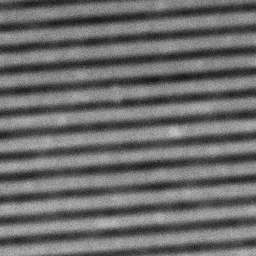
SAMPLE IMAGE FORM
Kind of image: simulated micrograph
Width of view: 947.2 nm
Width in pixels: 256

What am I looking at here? parallel lines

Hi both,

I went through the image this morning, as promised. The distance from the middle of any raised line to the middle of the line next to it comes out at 0.079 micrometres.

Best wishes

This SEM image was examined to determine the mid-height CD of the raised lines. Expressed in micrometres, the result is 0.035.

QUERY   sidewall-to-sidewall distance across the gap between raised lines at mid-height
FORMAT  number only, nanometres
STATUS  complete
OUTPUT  44.2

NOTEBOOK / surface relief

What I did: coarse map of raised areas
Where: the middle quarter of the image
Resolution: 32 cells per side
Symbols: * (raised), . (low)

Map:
.................***************
....****************************
***********************.........
********..*.....................
................................
....................************
........************************
*************************.......
**************..................
*...............................
...........................*****
...............*****************
...**************************...
*****************...............
*****...........................
................................
...................*************
.......*************************
**********************..........
**********......................
................................
........................********
............********************
***********************.........
***********.....................
................................
..........................******
................****************
..*.***************************.
******************..............
******..........................
..............................**